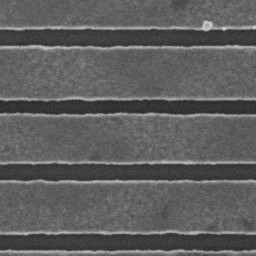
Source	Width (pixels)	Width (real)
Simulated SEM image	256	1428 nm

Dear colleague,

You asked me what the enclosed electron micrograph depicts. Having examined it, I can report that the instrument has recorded lines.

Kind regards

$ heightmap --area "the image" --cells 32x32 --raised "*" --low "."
********************************
********************************
********************************
*******************.************
................................
................................
********************************
********************************
********************************
********************************
********************************
********************************
*..*.**....*....................
................................
********************************
********************************
********************************
********************************
********************************
********************************
................................
................................
................................
********************************
********************************
********************************
********************************
********************************
********************************
................................
................................
********************************